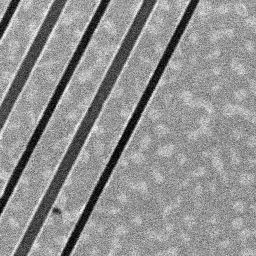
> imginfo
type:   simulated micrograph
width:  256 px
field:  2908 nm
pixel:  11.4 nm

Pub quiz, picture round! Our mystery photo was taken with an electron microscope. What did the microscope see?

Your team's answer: parallel lines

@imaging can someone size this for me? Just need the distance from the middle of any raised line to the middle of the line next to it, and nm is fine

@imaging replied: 464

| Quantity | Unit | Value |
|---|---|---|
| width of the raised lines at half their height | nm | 329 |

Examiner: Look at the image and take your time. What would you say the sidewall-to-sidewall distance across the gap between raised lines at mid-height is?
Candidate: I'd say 0.11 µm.